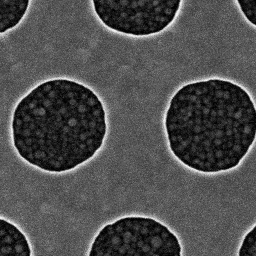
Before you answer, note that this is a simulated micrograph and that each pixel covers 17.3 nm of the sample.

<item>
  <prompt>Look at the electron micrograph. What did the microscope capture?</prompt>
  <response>holes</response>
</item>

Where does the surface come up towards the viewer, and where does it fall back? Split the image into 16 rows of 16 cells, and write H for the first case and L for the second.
LLHHHHLLLLLHHHHL
LHHHHHHLLLLHHHHH
HHHHHHHHHHHHHHHH
HHHHHHHHHHHHHHHH
HHHHHHHHHHHHHHHH
HHLLLHHHHHHLLLLH
HLLLLLHHHHHLLLLL
HLLLLLLHHHLLLLLL
HLLLLLLHHHLLLLLL
HLLLLLHHHHHLLLLH
HHHLHHHHHHHHLLHH
HHHHHHHHHHHHHHHH
HHHHHHHHHHHHHHHH
HHHHHHHHHHHHHHHH
LHHHHHLLLLLHHHHH
LLHHHHLLLLLHHHHL